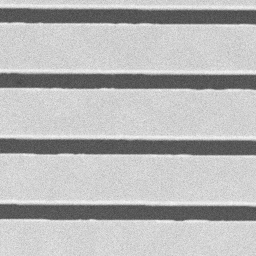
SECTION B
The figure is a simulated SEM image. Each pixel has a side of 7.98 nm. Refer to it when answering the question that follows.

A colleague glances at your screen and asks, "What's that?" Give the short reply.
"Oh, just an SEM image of lines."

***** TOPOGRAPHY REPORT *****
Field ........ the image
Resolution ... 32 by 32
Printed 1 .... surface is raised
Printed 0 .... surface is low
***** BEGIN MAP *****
11111111111111111111111111111111
00000000000000000000000000000000
00000000000000000000000000000000
11111111111111111111111111111111
11111111111111111111111111111111
11111111111111111111111111111111
11111111111111111111111111111111
11111111111111111111111111111111
11111111111111111111111111111111
00000000000000000000000000000000
00000000000000000000000000000000
11111111111111111111111111111111
11111111111111111111111111111111
11111111111111111111111111111111
11111111111111111111111111111111
11111111111111111111111111111111
11111111111111111111111111111111
00000000000000000000000000000000
00000000000000000000000000000000
11111111111111111111111100000000
11111111111111111111111111111111
11111111111111111111111111111111
11111111111111111111111111111111
11111111111111111111111111111111
11111111111111111111111111111111
00000000011111111111111111111111
00000000000000000000000000000000
11111110011100000000000000000000
11111111111111111111111111111111
11111111111111111111111111111111
11111111111111111111111111111111
11111111111111111111111111111111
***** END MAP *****